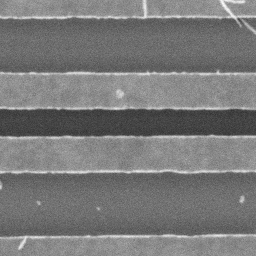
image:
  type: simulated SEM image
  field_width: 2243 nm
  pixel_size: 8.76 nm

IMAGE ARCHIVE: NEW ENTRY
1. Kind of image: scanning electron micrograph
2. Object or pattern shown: lines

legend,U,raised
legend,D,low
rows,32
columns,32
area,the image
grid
UUUUUUUUUUUUUUUUUUUUUUUUUUUUUUUU
UUUUUUUUUUUUUUUUUUUUUUUUUUUUUUUU
DDDDDDDDDDDDDDDDDDDDDDDDDDDDDDDD
DDDDDDDDDDDDDDDDDDDDDDDDDDDDDDDD
DDDDDDDDDDDDDDDDDDDDDDDDDDDDDDDD
DDDDDDDDDDDDDDDDDDDDDDDDDDDDDDDD
DDDDDDDDDDDDDDDDDDDDDDDDDDDDDDDD
DDDDDDDDDDDDDDDDDDDDDDDDDDDDDDDD
DDDDDDDDDDDDDDDDDDDDDDDDDDDDDDDD
UUUUUUUUUUUUUUUUUUUUUUUUUUUUUUUU
UUUUUUUUUUUUUUUUUUUUUUUUUUUUUUUU
UUUUUUUUUUUUUUUUUUUUUUUUUUUUUUUU
UUUUUUUUUUUUUUUUUUUUUUUUUUUUUUUU
UUUUUUUUUUUUUUUUUUUUUUUUUUUUUUUU
DDDDDDDDDDDDDDDDDDDDDDDDDDDDDDDD
DDDDDDDDDDDDDDDDDDDDDDDDDDDDDDDD
DDDDDDDDDDDDDDDDDDDDDDDDDDDDDDDD
UUUUUUUUUUUUUUUUUUUUUUUUUUUUUUUU
UUUUUUUUUUUUUUUUUUUUUUUUUUUUUUUU
UUUUUUUUUUUUUUUUUUUUUUUUUUUUUUUU
UUUUUUUUUUUUUUUUUUUUUUUUUUUUUUUU
UUUDUUUUUUUDDDDUUDDDDDUUUDDDDDDD
DDDDDDDDDDDDDDDDDDDDDDDDDDDDDDDD
DDDDDDDDDDDDDDDDDDDDDDDDDDDDDDDD
DDDDDDDDDDDDDDDDDDDDDDDDDDDDDDDD
DDDDDDDDDDDDDDDDDDDDDDDDDDDDDDDD
DDDDDDDDDDDDDDDDDDDDDDDDDDDDDDDD
DDDDDDDDDDDDDDDDDDDDDDDDDDDDDDDD
DDDDDDDDDDDDDDDDDDDDDDDDDDDDDDDD
DDDDDDDDDDDDDDDDDDDDUUDDDUUUUUUU
UUUUUUUUUUUUUUUUUUUUUUUUUUUUUUUU
UUUUUUUUUUUUUUUUUUUUUUUUUUUUUUUU